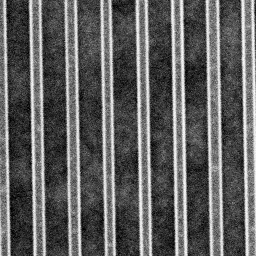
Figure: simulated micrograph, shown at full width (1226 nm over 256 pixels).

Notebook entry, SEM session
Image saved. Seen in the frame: parallel lines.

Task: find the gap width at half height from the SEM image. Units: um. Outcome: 0.12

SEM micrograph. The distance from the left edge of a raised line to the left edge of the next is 169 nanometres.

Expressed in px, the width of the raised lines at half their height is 11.